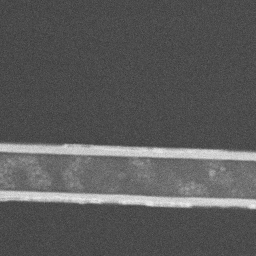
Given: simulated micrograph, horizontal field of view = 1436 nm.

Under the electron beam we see one or a few lines or trenches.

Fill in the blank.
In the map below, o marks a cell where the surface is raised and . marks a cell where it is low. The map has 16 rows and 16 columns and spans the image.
oooooooooooooooo
oooooooooooooooo
oooooooooooooooo
oooooooooooooooo
oooooooooooooooo
oooooooooooooooo
oooooooooooooooo
oooooooooooooooo
oooooooooooooooo
........oooooooo
................
................
oooooooooo......
oooooooooooooooo
oooooooooooooooo
oooooooooooooooo